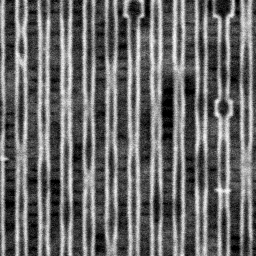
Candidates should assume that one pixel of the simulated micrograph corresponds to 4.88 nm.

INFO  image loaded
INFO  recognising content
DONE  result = wiring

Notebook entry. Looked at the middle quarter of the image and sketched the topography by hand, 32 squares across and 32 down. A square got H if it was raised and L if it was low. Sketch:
HLLLLHHLLLLHHLLLHHLLLLHHLLLLHHLL
HHLLLHHLLLLHLLLLHHLLLLHHLLLLHLLL
HHLLLHHLLLLHLLLLHHLLLLHHLLLLHHLL
HLLLLHHLLLLHLLLLHHLLLLHHLLLLHHLL
HLLLLHHLLLLHLLLLHHLLLLHHLLLLHHLL
HLLLLHHLLLLHHLLLHHLLLLHHLLLLHHLL
HLLLLHHLLLLHHLLLHHLLLLHHLLLLHHLL
HLLLLHHLLLLHHLLLHHLLLLHHLLLLHHLL
HLLLLHHLLLLHHLLLHHLLLLHHLLLLHHLL
HLLLLHHLLLLHHLLLHHLLLLHHLLLLHHLL
HLLLLHHLLLLHHLLLHHLLLLHHLLLLHHLL
HLLLLHHLLLLHHLLLHHLLLLHHLLLLHHLL
HLLLLHHLLLLHHLLLHHLLLLHHLLLLHHLL
HLLLLHHLLLLHHLLLHHLLLLHHLLLLHHLL
HLLLLHHLLLLHHLLLHHLLLLHHLLLLHHLL
HLLLLHHLLLLHHLLLHHLLLLHHLLLLHHLL
HLLLLHHLLLLHHLLLHHLLLLHHLLLLHHLL
HLLLLHHLLLLHHLLLLHLLLLHHLLLLHHLL
HLLLLHHLLLLHHLLLLHLLLLHHLLLLHHLL
HHLLLHHLLLLHHLLLLHLLLLHHLLLLHHLL
HHLLLHHLLLLHHLLLLHLLLLHHLLLLHHLL
HHLLLHHLLLLHHLLLLHLLLLHHLLLLHHLL
HHLLLHHLLLLHHLLLHHLLLLHHLLLLHHLL
HHLLLHHLLLLHHLLLHHLLLLHHLLLLHHLL
HHLLLHHLLLLHHLLLHHLLLLHHLLLLHHLL
HHLLLHHLLLLHHLLLHHLLLLHHLLLLHHLL
HHLLLHHLLLLHHLLLHHLLLLHHLLLLHHLL
HHLLLHHLLLLHHLLLHHLLLLHHLLLLHHLL
HHLLLHHLLLLHHLLLHHLLLLHHLLLLHHLL
HHLLLLHLLLLHHLLLHHLLLLHHLLLHHHLL
HHLLLHHLLLLHHLLLHHLLLLHHLLLHHHLL
HHLLLHHLLLLHHLLLHHLLLLHHLLLLHHLL